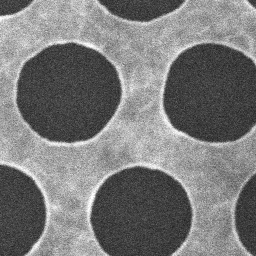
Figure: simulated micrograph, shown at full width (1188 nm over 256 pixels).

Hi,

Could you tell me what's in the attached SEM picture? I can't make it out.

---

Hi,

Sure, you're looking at holes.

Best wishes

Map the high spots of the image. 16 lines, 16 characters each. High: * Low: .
..*****....*****
****************
****************
**.....****....*
*......****.....
*.......**......
*......***......
**.....***......
**....******...*
****************
.*******.*******
..****.....****.
...***......***.
...***......***.
...***......***.
..****.....****.